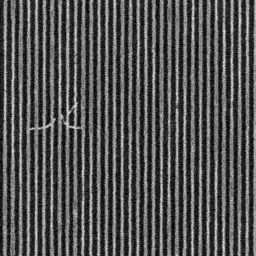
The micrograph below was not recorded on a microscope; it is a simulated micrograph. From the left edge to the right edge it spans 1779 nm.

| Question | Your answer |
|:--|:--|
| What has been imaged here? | parallel lines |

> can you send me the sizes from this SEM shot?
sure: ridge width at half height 13.9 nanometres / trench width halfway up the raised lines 5.74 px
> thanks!